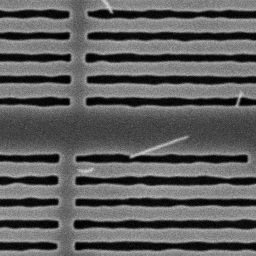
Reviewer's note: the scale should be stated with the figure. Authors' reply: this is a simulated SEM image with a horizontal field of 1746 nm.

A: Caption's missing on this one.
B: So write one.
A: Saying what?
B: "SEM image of groups of lines, slits or small figures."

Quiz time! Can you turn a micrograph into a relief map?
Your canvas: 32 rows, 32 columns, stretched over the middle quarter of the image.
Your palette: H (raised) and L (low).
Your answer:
HHHHHHHHHHHHHHHHHHHHHHHHHHHHHHHH
HHHHHHHHHHHHHHHHHHHHHHHHHHHHHHHH
HHHHHHHHHHHHHHHHHHHHHHHHHHHHHHHH
LLHHHHLLLLLLLLLLLLLLLLLLLLLLLLLL
LLHHHHLLLLLLLLLLLLLLLLLLLLLLLLLL
HHHHHHHHHHHHHHHHHHHHHHHHHHHHHHHH
HHHHHHHHHHHHHHHHHHHHHHHHHHHHHHHH
HHHHHHHHHHHHHHHHHHHHHHHHHHHHHHHH
LHHHHHLLLLLLLLLLLLLLLLLLLLLLLLLH
LLHHHLLLLLLLLLLLLLLLLLLLLLLLLLLL
LHHHHHLHHHHHHHHHLLLLHHLLLLLLLLHH
HHHHHHHHHHHHHHHHHHHHHHHHHHHHHHHH
HHHHHHHHHHHHHHHHHHHHHHHHHHHHHHHH
HHHHHHHHHHHHHHHHHHHHHHHHHHHHHHHH
HHHHHHHHHHHHHHHHHHHHHHHHHHHHHHHH
HHHHHHHHHHHHHHHHHHHHHHHHHHHHHHHH
HHHHHHHHHHHHHHHHHHHHHHHHHHHHHHHH
HHHHHHHHHHHHHHHHHHHHHHHHHHHHHHHH
HHHHHHHHHHHHHHHHHHHHHHHHHHHHHHHH
HHHHHHHHHHHHHHHHHHHHHHHHHHHHHHHH
HHHHHHHHHHHHHHHHHHHHHHHHHHHHHHHH
HHHHHHHHHHHHHHHHHHHHHHHHHHHHHHHH
HHHHHHHLLLLLLLLHHHHHHHHHHHLLHHHL
HHHLLLLLLLLLLLLLLLLLLLLLLLLLLLLL
HHHLLLLLLLLLLLLLLLLLLLLLLLLLLLLL
HHHHHHHHHHHHHHHHHHHHHHHHHHHHHHHH
HHHHHHHHHHHHHHHHHHHHHHHHHHHHHHHH
HHHHHHHHHHHHHHHHHHHHHHHHHHHHHHHH
HHHLLLLLLLLLLLLLLLLLLLLLLLLLLLLL
HHHLLLLLLLLLLLLLLLLLLLLLLLLLLLLL
HHHHHHHHHHHHHHHHHHHHHLLHHHHHHHLH
HHHHHHHHHHHHHHHHHHHHHHHHHHHHHHHH